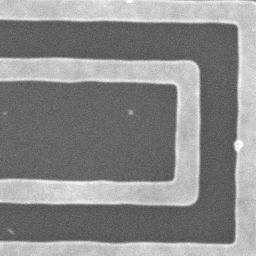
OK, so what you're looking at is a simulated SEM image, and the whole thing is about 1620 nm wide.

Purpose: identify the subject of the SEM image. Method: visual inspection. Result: groups of lines, slits or small figures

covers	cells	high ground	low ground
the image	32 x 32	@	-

@@@@@@@@@@@@@@@@@@@@@@@@@@@@@@@@
@@@@@@@@@@@@@@@@@@@@@@@@@@@@@@@@
--------@@@@@@@@@@@@@@@@@@@@@@@@
------------------------------@@
------------------------------@@
------------------------------@@
------------------------------@@
@@@@@@@@@@@@------------------@@
@@@@@@@@@@@@@@@@@@@@@@@@@-----@@
@@@@@@@@@@@@@@@@@@@@@@@@@-----@@
----------------------@@@-----@@
----------------------@@@-----@@
----------------------@@@-----@@
----------------------@@@-----@@
----------------------@@@-----@@
----------------------@@@-----@@
----------------------@@@-----@@
----------------------@@@----@@@
----------------------@@@----@@@
----------------------@@@-----@@
----------------------@@@-----@@
----------------------@@@-----@@
-@@-------------------@@@-----@@
@@@@@@@@@@@@@@@@@@@@@@@@@-----@@
@@@@@@@@@@@@@@@@@@@@@@@@@-----@@
-----------------@@@@@@@-----@@@
-----------------------------@@@
------------------------------@@
------------------------------@@
-----------------------------@@@
@@@@@@@@@@@@@@@@@@@@@@@@@----@@@
@@@@@@@@@@@@@@@@@@@@@@@@@@@@@@@@